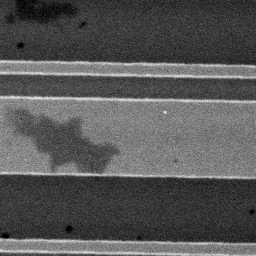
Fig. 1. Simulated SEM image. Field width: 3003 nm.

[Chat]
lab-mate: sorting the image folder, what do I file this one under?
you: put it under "lines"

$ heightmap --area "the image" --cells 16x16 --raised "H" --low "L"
LLLLLLLLLLLLLLLL
LLLLLLLLLLLLLLLL
LLLLLLLLLLLLLLLL
LLLLLLLLLLLLLLLL
HHHHHHHHHHHHHHHH
HHHHHHHHHHHHHHHH
HHHHHHHHHHHHHHHH
HHHHHHHHHHHHHHHH
HHHHHHHHHHHHHHHH
HHHHHHHHHHHHHHHH
HHHHHHHHHHHHHHHH
LLLLLLLLLLLLLLLL
LLLLLLLLLLLLLLLL
LLLLLLLLLLLLLLLL
LLLLLLLLLLLLLLLL
HHHHHHHHHHHHHHHH